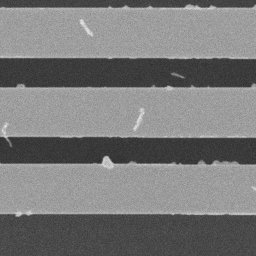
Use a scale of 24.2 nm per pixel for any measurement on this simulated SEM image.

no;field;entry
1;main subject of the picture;lines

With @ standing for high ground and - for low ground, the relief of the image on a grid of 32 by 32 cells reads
--------------------------------
@@@@@@@@@@@@@@@@@@@@@@@@@@@@@@@@
@@@@@@@@@@@@@@@@@@@@@@@@@@@@@@@@
@@@@@@@@@@@@@@@@@@@@@@@@@@@@@@@@
@@@@@@@@@@@@@@@@@@@@@@@@@@@@@@@@
@@@@@@@@@@@@@@@@@@@@@@@@@@@@@@@@
@@@@@@@@@@@@@@@@@@@@@@@@@@@@@@@@
--------------------------------
--------------------------------
--------------------------------
--------------------------------
@@@@@@@@@@@@@@@@@@@@@@@@@@@@@@@@
@@@@@@@@@@@@@@@@@@@@@@@@@@@@@@@@
@@@@@@@@@@@@@@@@@@@@@@@@@@@@@@@@
@@@@@@@@@@@@@@@@@@@@@@@@@@@@@@@@
@@@@@@@@@@@@@@@@@@@@@@@@@@@@@@@@
@@@@@@@@@@@@@@@@@@@@@@@@@@@@@@@@
--------------------------------
--------------------------------
--------------------------------
------------@@@-----------------
@@@@@@@@@@@@@@@@@@@@@@@@@@@@@@@@
@@@@@@@@@@@@@@@@@@@@@@@@@@@@@@@@
@@@@@@@@@@@@@@@@@@@@@@@@@@@@@@@@
@@@@@@@@@@@@@@@@@@@@@@@@@@@@@@@@
@@@@@@@@@@@@@@@@@@@@@@@@@@@@@@@@
@@@@@@@@@@@@@@@@@@@@@@@@@@@@@@@@
--------------------------------
--------------------------------
--------------------------------
--------------------------------
--------------------------------